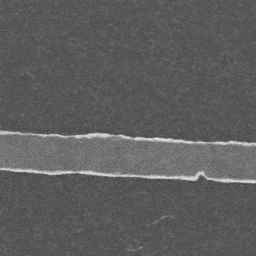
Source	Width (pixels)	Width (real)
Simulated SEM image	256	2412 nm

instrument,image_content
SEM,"one or a few lines or trenches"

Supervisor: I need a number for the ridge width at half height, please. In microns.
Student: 0.358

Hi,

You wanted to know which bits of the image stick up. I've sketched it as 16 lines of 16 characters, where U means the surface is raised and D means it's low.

DDDDDDDDDDDDDDDD
DDDDDDDDDDDDDDDD
DDDDDDDDDDDDDDDD
DDDDDDDDDDDDDDDD
DDDDDDDDDDDDDDDD
DDDDDDDDDDDDDDDD
DDDDDDDDDDDDDDDD
DDDDDDDDDDDDDDDD
UUUUDUUDDDDDDDDD
UUUUUUUUUUUUUUUU
UUUUUUUUUUUUUUUU
DDDDDDDDDDDDDDDD
DDDDDDDDDDDDDDDD
DDDDDDDDDDDDDDDD
DDDDDDDDDDDDDDDD
DDDDDDDDDDDDDDDD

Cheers